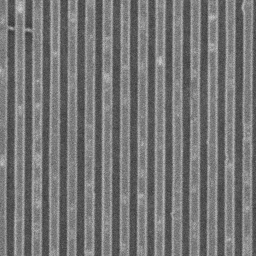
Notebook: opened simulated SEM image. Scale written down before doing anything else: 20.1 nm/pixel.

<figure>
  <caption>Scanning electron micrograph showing parallel lines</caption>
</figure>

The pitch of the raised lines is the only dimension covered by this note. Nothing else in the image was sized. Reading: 352 nm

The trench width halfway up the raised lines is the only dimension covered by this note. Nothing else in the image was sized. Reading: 0.173 um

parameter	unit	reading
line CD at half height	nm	173